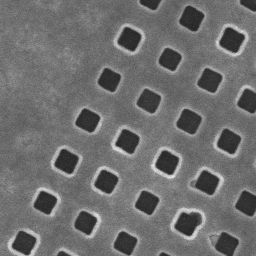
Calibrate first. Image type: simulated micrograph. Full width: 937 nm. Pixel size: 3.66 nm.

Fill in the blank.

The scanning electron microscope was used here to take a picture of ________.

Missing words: a regular array of holes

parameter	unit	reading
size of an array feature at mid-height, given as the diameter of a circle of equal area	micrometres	0.0857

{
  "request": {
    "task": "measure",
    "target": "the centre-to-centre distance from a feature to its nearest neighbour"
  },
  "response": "164 nm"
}